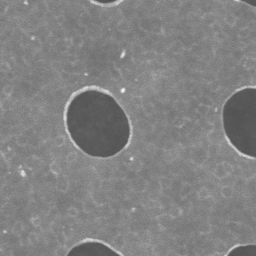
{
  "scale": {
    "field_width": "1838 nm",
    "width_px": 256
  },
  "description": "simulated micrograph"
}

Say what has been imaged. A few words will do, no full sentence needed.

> holes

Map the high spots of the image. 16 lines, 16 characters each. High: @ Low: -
@@@@@@@@@@@@@@@@
@@@@@@@@@@@@@@@@
@@@@@@@@@@@@@@@@
@@@@@@@@@@@@@@@@
@@@@@@@@@@@@@@@@
@@@@@@@@@@@@@@@@
@@@@---@@@@@@@--
@@@@----@@@@@@--
@@@@----@@@@@@--
@@@@@--@@@@@@@@-
@@@@@@@@@@@@@@@@
@@@@@@@@@@@@@@@@
@@@@@@@@@@@@@@@@
@@@@@@@@@@@@@@@@
@@@@@@@@@@@@@@@@
@@@@@--@@@@@@@@-